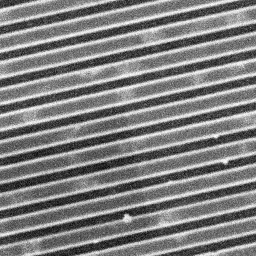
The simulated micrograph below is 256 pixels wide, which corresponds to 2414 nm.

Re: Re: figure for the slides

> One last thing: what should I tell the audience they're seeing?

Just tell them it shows parallel lines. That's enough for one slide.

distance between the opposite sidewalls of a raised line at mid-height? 15.9 px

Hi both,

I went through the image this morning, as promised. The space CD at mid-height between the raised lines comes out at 94.4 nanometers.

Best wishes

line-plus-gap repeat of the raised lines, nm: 243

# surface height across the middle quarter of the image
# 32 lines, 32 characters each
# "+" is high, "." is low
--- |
.........++++++++++++++++++.....
.....++++++++++++++++++.........
.+++++++++++++++++............++
++++++++++++++............++++++
+++++++++............+++++++++++
+++++............+++++++++++++++
............++++++++++++++++++..
........++++++++++++++++++......
...++++++++++++++++++...........
+++++++++++++++++............+++
++++++++++++............++++++++
++++++++............++++++++++++
+++............+++++++++++++++++
...........++++++++++++++++++...
......++++++++++++++++++........
.+++++++++++++++++++............
+++++++++++++++............+++++
++++++++++.............+++++++++
++++++............++++++++++++++
+............++++++++++++++++++.
.........+++++++++++++++++......
....++++++++++++++++++..........
+++++++++++++++++............+++
+++++++++++++............+++++++
+++++++++............+++++++++++
++++............++++++++++++++++
...........++++++++++++++++++...
.......+++++++++++++++++........
...+++++++++++++++++............
+++++++++++++++...........++++++
+++++++++++............+++++++++
++++++............++++++++++++++